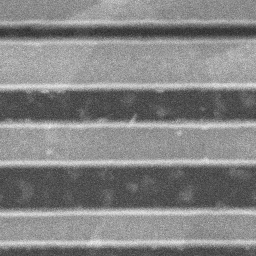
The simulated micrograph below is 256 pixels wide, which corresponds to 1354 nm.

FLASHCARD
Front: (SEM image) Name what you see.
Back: one or a few lines or trenches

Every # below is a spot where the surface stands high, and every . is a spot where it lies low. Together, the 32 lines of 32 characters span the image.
################################
################################
################################
................................
................................
################################
################################
################################
################################
################################
################################
................................
................................
................................
................................
................................
################################
################################
################################
################################
................................
................................
................................
................................
................................
................................
................................
################################
################################
################################
................................
................................